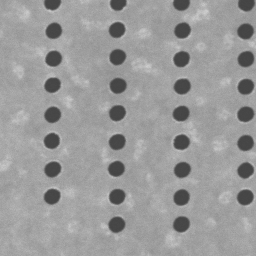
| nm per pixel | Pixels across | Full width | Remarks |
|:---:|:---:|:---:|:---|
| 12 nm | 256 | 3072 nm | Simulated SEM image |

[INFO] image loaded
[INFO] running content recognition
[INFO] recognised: a regular array of holes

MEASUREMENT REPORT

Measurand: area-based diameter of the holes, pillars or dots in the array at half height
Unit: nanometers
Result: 200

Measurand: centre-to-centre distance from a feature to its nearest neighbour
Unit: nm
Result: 328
